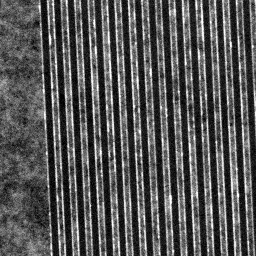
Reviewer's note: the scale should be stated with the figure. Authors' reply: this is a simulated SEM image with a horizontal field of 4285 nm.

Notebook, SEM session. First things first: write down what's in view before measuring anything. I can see parallel lines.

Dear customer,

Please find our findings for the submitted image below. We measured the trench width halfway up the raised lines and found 0.13 microns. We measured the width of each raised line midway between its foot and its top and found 98.2 nanometers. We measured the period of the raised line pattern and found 0.225 micrometres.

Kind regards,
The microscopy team